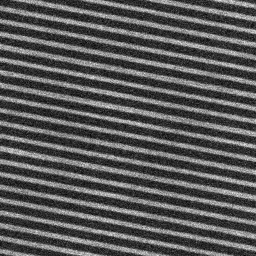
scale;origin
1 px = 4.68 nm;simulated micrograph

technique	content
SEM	parallel lines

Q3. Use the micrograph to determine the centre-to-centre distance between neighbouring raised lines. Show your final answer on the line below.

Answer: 58.6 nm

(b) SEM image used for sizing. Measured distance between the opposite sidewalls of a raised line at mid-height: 0.0172 microns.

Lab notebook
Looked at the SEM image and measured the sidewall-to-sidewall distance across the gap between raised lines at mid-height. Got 39 nm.